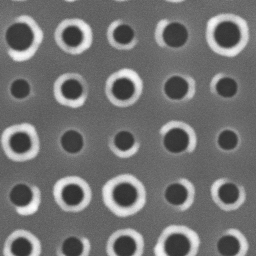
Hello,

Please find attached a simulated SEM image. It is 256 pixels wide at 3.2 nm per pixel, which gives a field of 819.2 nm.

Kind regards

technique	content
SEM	a regular array of holes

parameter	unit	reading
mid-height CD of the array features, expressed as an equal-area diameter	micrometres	0.0709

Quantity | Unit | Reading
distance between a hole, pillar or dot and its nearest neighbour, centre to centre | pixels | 51.7